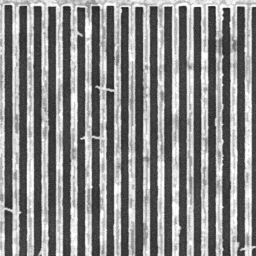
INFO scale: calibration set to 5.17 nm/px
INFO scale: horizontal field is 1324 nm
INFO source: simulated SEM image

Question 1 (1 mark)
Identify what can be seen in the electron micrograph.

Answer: parallel lines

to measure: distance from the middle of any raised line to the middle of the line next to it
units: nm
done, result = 75.3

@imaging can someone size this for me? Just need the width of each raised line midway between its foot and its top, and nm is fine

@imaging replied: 30.4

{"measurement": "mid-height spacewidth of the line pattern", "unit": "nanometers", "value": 45.9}